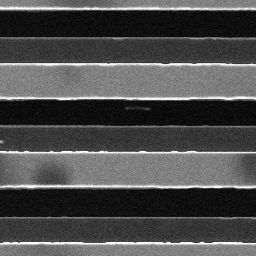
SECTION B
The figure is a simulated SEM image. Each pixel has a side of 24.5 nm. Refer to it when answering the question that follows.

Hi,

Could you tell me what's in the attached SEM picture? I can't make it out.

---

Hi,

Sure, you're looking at lines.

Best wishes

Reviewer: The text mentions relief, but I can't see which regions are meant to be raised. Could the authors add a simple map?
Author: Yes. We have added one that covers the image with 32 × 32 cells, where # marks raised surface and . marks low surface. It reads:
################################
................................
................................
................................
................................
################################
################################
################################
################################
################################
################################
################################
................................
................................
................................
................................
################################
################################
################################
################################
################################
################################
################################
................................
................................
................................
................................
################################
################################
################################
################################
################################